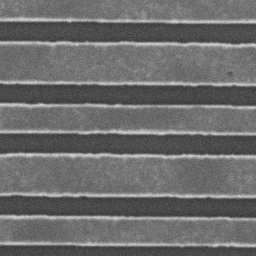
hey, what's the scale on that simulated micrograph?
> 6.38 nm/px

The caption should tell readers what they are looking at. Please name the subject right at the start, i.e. lines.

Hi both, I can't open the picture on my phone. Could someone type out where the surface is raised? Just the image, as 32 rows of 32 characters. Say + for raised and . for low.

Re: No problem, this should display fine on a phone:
++++++++++++++++++++++++++++++++
++++++++++++++++++++++++++++++++
++++++++++++++++++++++++++++++++
................................
................................
+++++++++++++++++++++++++.......
++++++++++++++++++++++++++++++++
++++++++++++++++++++++++++++++++
++++++++++++++++++++++++++++++++
++++++++++++++++++++++++++++++++
............++++++++++++++++++++
................................
................................
++++++++++++++++++++++++++++++++
++++++++++++++++++++++++++++++++
++++++++++++++++++++++++++++++++
++++++++++++++++++++++++++++++++
................................
................................
+++++++++++++++++++...++........
++++++++++++++++++++++++++++++++
++++++++++++++++++++++++++++++++
++++++++++++++++++++++++++++++++
++++++++++++++++++++++++++++++++
......++.+.+++++++++++++++++++++
................................
................................
++++++++++++++++++++++++++++++++
++++++++++++++++++++++++++++++++
++++++++++++++++++++++++++++++++
++++++++++++++++++++++++++++++++
................................